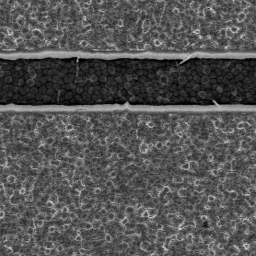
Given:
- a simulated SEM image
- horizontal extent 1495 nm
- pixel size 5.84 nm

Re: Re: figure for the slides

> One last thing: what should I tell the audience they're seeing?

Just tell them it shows one or a few lines or trenches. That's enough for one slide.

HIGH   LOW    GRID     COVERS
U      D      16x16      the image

UUUUUUUUUUUUUUUU
UUUUUUUUUUUUUUUU
UUUUUUUUUUUUUUUU
UUDDDUUUUUUUDUUU
DDDDDDDDDDDDDDDD
DDDDDDDDDDDDDDDD
DDDDDDDDDDDDDDDD
UUUUUUUUUUUUUUUU
UUUUUUUUUUUUUUUU
UUUUUUUUUUUUUUUU
UUUUUUUUUUUUUUUU
UUUUUUUUUUUUUUUU
UUUUUUUUUUUUUUUU
UUUUUUUUUUUUUUUU
UUUUUUUUUUUUUUUU
UUUUUUUUUUUUUUUU